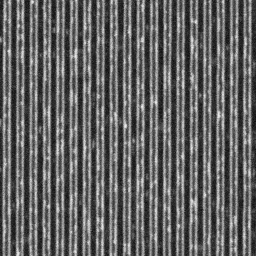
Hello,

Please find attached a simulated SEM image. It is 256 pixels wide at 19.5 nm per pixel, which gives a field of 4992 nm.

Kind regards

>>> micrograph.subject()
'parallel lines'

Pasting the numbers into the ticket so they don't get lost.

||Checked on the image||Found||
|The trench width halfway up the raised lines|144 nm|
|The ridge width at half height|127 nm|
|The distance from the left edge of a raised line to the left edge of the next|13.4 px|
